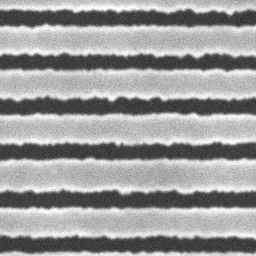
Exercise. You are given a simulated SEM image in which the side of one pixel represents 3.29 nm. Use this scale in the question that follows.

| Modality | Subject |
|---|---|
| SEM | lines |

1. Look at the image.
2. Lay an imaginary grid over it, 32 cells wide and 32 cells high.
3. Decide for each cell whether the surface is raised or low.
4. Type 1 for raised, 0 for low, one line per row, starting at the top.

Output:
11111111111111111111111111111111
00000000000000000000110011001000
00000000000000000000000000000000
11101111111111111111111011111111
11111111111111111111111111111111
11111111111111111111111111111111
11111111111111111111111111111111
00000000000000000000000000000000
00000000000000000000000000000000
11111111111111111111111111111111
11111111111111111111111111111111
11111111111111111111111111111111
00000000000000000000000000000000
00000000000000000000000000000000
11111111111111111111111110111111
11111111111111111111111111111111
11111111111111111111111111111111
11111111111111111111111111111111
00000000000000000000000000000000
00000000000000000000000000000000
11111111111111111111111111111111
11111111111111111111111111111111
11111111111111111111111111111111
11111111111111111111111111111111
00000000000000000000000000000000
00000000000000000000000000000000
11111111111111111111111111111111
11111111111111111111111111111111
11111111111111111111111111111111
01011111101101111100001101111011
00000000000000000000000000000000
00000000000000000000000000000000